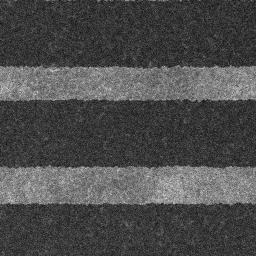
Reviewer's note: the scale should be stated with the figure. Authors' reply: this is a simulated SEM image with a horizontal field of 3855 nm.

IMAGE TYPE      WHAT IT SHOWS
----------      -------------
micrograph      one or a few lines or trenches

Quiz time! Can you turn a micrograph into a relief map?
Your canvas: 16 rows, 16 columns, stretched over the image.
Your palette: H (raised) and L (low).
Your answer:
LLLLLLLLLLLLLLLL
LLLLLLLLLLLLLLLL
LLLLLLLLLLLLLLLL
LLLLLLLLLLLLLLLL
HHHHHHHHHHHHHHHH
HHHHHHHHHHHHHHHH
LLLLLLLLLLLLLLLL
LLLLLLLLLLLLLLLL
LLLLLLLLLLLLLLLL
LLLLLLLLLLLLLLLL
LLHLLLHLHHHHHLHH
HHHHHHHHHHHHHHHH
HHHHHHHHHHHHHHHH
LLLLLLLLLLLLLLLL
LLLLLLLLLLLLLLLL
LLLLLLLLLLLLLLLL